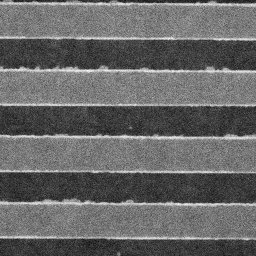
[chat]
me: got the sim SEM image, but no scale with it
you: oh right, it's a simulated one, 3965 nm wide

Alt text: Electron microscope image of lines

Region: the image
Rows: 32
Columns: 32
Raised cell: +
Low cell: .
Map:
++++++++++++++++++++++++++++++++
++++++++++++++++++++++++++++++++
++++++++++++++++++++++++++++++++
++++++++++++++++++++++++++++++++
++++++++++++++++++++++++++++++++
................................
................................
................................
................................
++++++++++++++++++++++++++++++++
++++++++++++++++++++++++++++++++
++++++++++++++++++++++++++++++++
++++++++++++++++++++++++++++++++
................................
................................
................................
................................
++++++++++++++++++++++++++++++++
++++++++++++++++++++++++++++++++
++++++++++++++++++++++++++++++++
++++++++++++++++++++++++++++++++
...........+++++++++++++++++++++
................................
................................
................................
++++++++++++++++++++++++++++++++
++++++++++++++++++++++++++++++++
++++++++++++++++++++++++++++++++
++++++++++++++++++++++++++++++++
++++++++++++++++++++++++++++++++
................................
................................